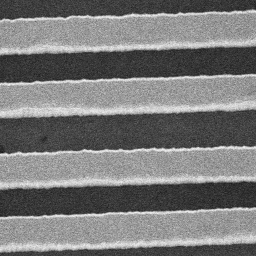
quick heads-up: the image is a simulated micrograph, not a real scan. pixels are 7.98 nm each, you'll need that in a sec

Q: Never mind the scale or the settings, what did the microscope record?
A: lines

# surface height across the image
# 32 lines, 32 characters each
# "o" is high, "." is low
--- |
................................
.............................ooo
oooooooooooooooooooooooooooooooo
oooooooooooooooooooooooooooooooo
oooooooooooooooooooooooooooooooo
oooooooooooooooooooooooooooooooo
ooooooooo.......................
................................
................................
.........................ooooooo
oooooooooooooooooooooooooooooooo
oooooooooooooooooooooooooooooooo
oooooooooooooooooooooooooooooooo
oooooooooooooooooooooooooooooooo
ooo.............................
................................
................................
................................
........................o.oooooo
oooooooooooooooooooooooooooooooo
oooooooooooooooooooooooooooooooo
oooooooooooooooooooooooooooooooo
oooooooooooooooooooooooooooooooo
o...............................
................................
................................
................oooooooooooooooo
oooooooooooooooooooooooooooooooo
oooooooooooooooooooooooooooooooo
oooooooooooooooooooooooooooooooo
ooooooooooooooooooooooooooo.....
................................